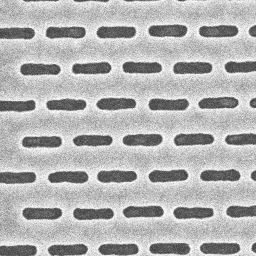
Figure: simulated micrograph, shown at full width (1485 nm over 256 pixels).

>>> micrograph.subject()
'a regular array of holes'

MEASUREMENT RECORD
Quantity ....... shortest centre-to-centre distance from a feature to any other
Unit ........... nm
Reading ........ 254